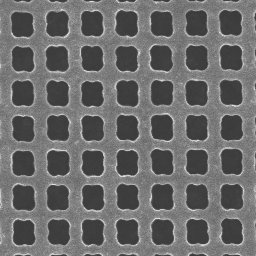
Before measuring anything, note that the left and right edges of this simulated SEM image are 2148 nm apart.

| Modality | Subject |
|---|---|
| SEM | a regular array of holes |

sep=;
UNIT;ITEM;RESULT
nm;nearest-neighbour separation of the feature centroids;287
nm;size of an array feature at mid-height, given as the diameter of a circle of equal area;208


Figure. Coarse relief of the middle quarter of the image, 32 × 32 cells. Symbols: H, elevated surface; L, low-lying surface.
LHHHHLLLLLHHHLLLLLHHHHLLLLLHHHHL
HHHHHHLLLHHHHHLLLLHHHHHLLLLHHHHH
HHHHHHHHHHHHHHHHHHHHHHHHHHHHHHHH
HHHHHHHHHHHHHHHHHHHHHHHHHHHHHHHH
HHHHHLLLLHHHHHLLLLHHHHLLLLLHHHHL
LHHHLLLLLLHHHLLLLLHHHHLLLLLHHHLL
LHHHLLLLLLHHHLLLLLHHHHLLLLLHHHLL
LHHHLLLLLLHHHLLLLLLHHHLLLLLHHHHL
LHHHLLLLLLHHHLLLLLLHHHLLLLLHHHLL
LHHHLLLLLLHHHLLLLLLHHHLLLLLHHHHL
HHHHHLLLLHHHHHHHHHHHHHHHHHHHHHHH
HHHHHHHHHHHHHHHHHHHHHHHHHHHHHHHH
HHHHHHHHHHHHHHHHHHHHHHHHHHHHHHHH
LHHHHLLLLHHHHLLLLLHHHHLLLLLHHHHL
LHHHLLLLLLHHHLLLLLLHHHLLLLLHHHLL
LHHHLLLLLLHHHLLLLLLHHHLLLLLHHHHL
LHHHLLLLLLHHHLLLLLLHHHLLLLLHHHHL
LHHHLLLLLLHHHLLLLLLHHHLLLLLHHHHL
LHHHHLLLLLHHHHLLLLHHHHLLLLLHHHHL
HHHHHHHHHHHHHHHHHHHHHHHHHHHHHHHH
HHHHHHHHHHHHHHHHHHHHHHHHHHHHHHHH
HHHHHHHHHHHHHHLHHHHHHHHLHHHHHHHH
LHHHHLLLLLHHHLLLLLHHHHLLLLLHHHHL
LHHHHLLLLLHHHLLLLLLHHHLLLLLHHHHL
LHHHHLLLLLHHHLLLLLLHHHLLLLLHHHHL
LHHHHLLLLLHHHLLLLLLHHHLLLLLHHHLL
LHHHHLLLLLHHHLLLLLLHHHLLLLLHHHHL
LHHHHLLLLHHHHHLLLLHHHHHLLHLHHHHH
HHHHHHHHHHHHHHHHHHHHHHHHHHHHHHHH
HHHHHHHHHHHHHHHHHHHHHHHHHHHHHHHH
HHHHHLLLLHHHHHLLLHHHHHLLLLLHHHHL
LHHHHLLLLLHHHLLLLLLHHHLLLLLHHHHL